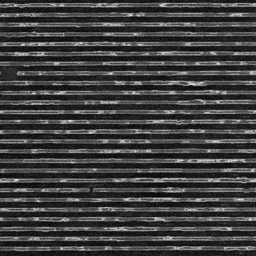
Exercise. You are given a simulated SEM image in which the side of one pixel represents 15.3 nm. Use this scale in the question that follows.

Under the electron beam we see parallel lines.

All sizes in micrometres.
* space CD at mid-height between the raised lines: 0.0916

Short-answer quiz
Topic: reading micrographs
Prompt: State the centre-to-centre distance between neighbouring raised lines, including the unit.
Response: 149 nm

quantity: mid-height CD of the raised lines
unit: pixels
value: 3.5